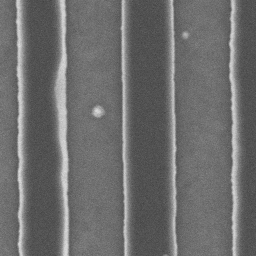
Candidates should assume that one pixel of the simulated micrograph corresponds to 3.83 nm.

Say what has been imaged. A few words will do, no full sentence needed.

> lines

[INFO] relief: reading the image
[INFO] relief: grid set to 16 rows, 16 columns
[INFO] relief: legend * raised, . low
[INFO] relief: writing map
.***....***...**
.***....***...**
.***....***...**
.***....***...**
.***....***...**
.***....***...**
.***....***....*
.***....***....*
.***....***....*
.***....***....*
.***....***....*
.***....***....*
.***....***....*
.***....***....*
.***....***....*
.***....***....*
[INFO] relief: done